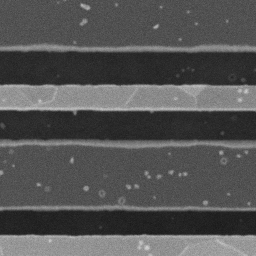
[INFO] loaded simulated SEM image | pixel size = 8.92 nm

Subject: lines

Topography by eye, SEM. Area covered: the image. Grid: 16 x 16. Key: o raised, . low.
oooooooooooooooo
oooooooooooooooo
oooooooooooooooo
................
................
oooooooooooooooo
oooooooooooooooo
................
................
oooooooooooooooo
oooooooooooooooo
oooooooooooooooo
oooooooooooooooo
................
................
oooooooooooooooo